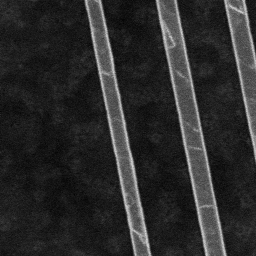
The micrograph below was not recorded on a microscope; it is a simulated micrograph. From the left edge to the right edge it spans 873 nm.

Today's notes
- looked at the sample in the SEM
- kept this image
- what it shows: one or a few lines or trenches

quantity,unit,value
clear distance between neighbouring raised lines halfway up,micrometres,0.186